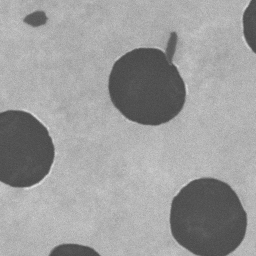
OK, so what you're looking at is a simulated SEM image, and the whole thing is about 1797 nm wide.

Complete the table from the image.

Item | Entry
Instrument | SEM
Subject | holes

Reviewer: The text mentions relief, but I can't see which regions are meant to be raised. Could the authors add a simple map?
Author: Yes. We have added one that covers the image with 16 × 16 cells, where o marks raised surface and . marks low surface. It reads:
ooooooooooooooo.
ooooooooooooooo.
ooooooooooooooo.
oooooooo..oooooo
ooooooo....ooooo
ooooooo.....oooo
ooooooo....ooooo
..oooooo...ooooo
...ooooooooooooo
...ooooooooooooo
...ooooooooooooo
..oooooooooo..oo
ooooooooooo....o
ooooooooooo....o
ooooooooooo....o
ooo...oooooo...o